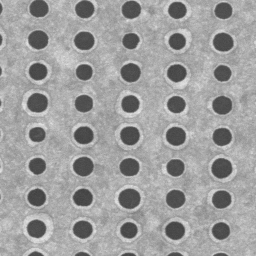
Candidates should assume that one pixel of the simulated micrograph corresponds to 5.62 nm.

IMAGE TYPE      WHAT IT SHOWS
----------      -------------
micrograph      a regular array of holes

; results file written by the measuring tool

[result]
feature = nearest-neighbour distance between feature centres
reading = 176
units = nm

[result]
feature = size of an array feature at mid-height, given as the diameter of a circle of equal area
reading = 112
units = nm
